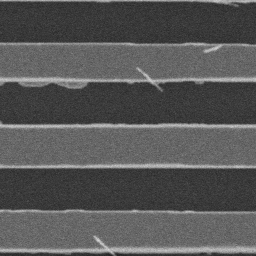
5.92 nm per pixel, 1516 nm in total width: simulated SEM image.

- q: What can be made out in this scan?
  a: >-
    lines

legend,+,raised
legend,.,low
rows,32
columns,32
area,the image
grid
................................
................................
................................
................................
................................
+++++++++++++++++......+++......
++++++++++++++++++++++++++++++++
++++++++++++++++++++++++++++++++
++++++++++++++++++++++++++++++++
++++++++++++++++++++++++++++++++
................................
................................
................................
................................
................................
................................
++++++++++++++++++++++++++++++++
++++++++++++++++++++++++++++++++
++++++++++++++++++++++++++++++++
++++++++++++++++++++++++++++++++
++++++++++++++++++++++++++++++++
................................
................................
................................
................................
................................
+++++++++++++++++++++++++.......
++++++++++++++++++++++++++++++++
++++++++++++++++++++++++++++++++
++++++++++++++++++++++++++++++++
++++++++++++++++++++++++++++++++
++++++++++++++++++++++++++++++++